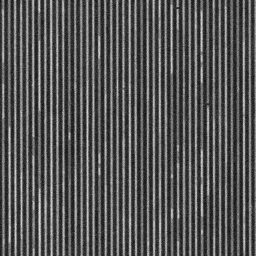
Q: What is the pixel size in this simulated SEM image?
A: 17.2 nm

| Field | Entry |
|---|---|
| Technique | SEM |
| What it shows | parallel lines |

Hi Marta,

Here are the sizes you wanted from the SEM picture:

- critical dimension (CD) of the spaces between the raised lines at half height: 75.2 nm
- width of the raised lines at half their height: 30.1 nm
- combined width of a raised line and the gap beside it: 103 nanometers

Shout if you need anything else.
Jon